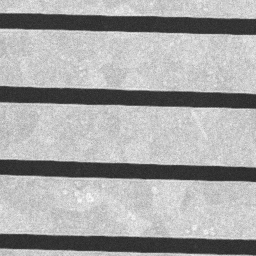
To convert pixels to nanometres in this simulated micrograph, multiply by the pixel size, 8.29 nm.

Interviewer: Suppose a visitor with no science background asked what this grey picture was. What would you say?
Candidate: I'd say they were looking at lines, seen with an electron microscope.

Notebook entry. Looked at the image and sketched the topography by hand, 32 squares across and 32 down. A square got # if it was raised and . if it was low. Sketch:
################################
################################
................................
................................
################################
################################
################################
################################
################################
################################
################################
...........................#####
................................
########################........
################################
################################
################################
################################
################################
################################
...................#############
................................
######################..........
################################
################################
################################
################################
################################
################################
.............###################
................................
##############..................